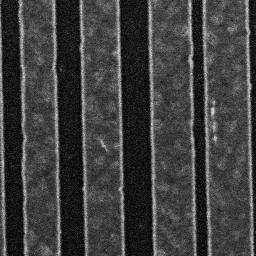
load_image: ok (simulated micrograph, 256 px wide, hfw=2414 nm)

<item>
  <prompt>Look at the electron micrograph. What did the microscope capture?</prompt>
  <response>one or a few lines or trenches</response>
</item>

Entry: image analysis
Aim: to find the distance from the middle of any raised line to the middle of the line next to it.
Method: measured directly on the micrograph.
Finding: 591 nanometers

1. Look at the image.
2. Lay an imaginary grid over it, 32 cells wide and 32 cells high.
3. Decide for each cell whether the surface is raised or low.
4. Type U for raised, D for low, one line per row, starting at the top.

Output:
DDDUUUUDDDUUUUUDDDDUUUUUDDUUUUUD
DDDUUUUDDDUUUUUDDDDUUUUUDDUUUUUD
DDDUUUUDDDUUUUUDDDDUUUUUDDUUUUUD
DDDUUUUDDDUUUUUDDDDUUUUUDDUUUUUD
DDDUUUUDDDUUUUUDDDDUUUUUDDUUUUUD
DDDUUUUDDDUUUUUDDDDUUUUUDDUUUUUD
DDDUUUUDDDUUUUUDDDDUUUUUDDUUUUUD
DDDUUUUDDDUUUUUDDDDUUUUUDDUUUUUD
DDDUUUUDDDUUUUUDDDDUUUUUDDUUUUUD
DDDUUUUDDDUUUUUDDDDUUUUUDDUUUUUD
DDDUUUUDDDUUUUUDDDDUUUUUDDUUUUUD
DDDUUUUDDDUUUUUDDDDUUUUUDDUUUUUD
DDDUUUUDDDUUUUUDDDDUUUUUDDUUUUUD
DDDUUUUDDDUUUUUDDDDUUUUUDDUUUUUD
DDDUUUUDDDUUUUUDDDDUUUUUDDUUUUUD
DDDUUUUDDDDUUUUDDDDUUUUUDDUUUUUD
DDDUUUUDDDDUUUUDDDDUUUUUDDUUUUUD
DDDUUUUDDDDUUUUDDDDUUUUUDDUUUUUD
DDDUUUUDDDDUUUUDDDDUUUUUDDUUUUUD
DDDUUUUDDDDUUUUDDDDUUUUUDDUUUUUD
DDDUUUUDDDDUUUUDDDDUUUUUDDUUUUUD
DDDUUUUDDDDUUUUDDDDUUUUUDDUUUUUD
DDDUUUUDDDDUUUUDDDDUUUUUDDUUUUUD
DDDUUUUDDDDUUUUDDDDUUUUUDDUUUUUD
DDDUUUUDDDDUUUUDDDDUUUUUDDUUUUUD
DDDUUUUDDDDUUUUDDDDUUUUUDDUUUUUD
DDDUUUUDDDDUUUUDDDDUUUUUDDUUUUUD
DDDUUUUDDDDUUUUDDDDUUUUUDDUUUUUU
DDDUUUUDDDDUUUUDDDDUUUUUDDUUUUUU
UDDUUUUDDDDUUUUDDDDUUUUUDDUUUUUD
UDDUUUUDDDDUUUUDDDDUUUUUDDUUUUUD
UDDUUUUDDDDUUUUDDDDUUUUUDDUUUUUD